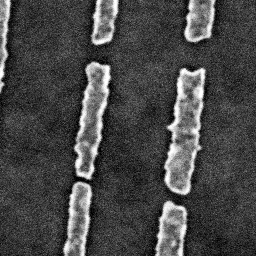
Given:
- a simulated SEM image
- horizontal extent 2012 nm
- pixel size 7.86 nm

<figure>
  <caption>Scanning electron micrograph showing one or a few lines or trenches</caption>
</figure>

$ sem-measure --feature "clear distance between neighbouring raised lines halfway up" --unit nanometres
584